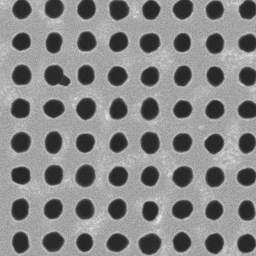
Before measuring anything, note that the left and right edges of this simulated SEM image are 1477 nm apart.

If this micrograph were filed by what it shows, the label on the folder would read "a regular array of holes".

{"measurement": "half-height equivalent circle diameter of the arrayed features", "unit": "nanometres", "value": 106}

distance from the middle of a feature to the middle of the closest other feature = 185 nm